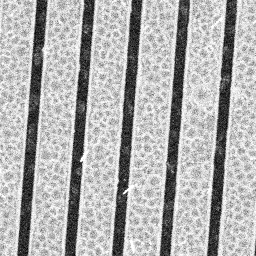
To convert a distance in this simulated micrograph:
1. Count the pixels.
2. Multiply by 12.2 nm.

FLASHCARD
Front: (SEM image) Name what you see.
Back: parallel lines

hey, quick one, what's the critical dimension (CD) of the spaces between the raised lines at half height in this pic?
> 164 nm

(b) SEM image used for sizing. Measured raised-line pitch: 579 nm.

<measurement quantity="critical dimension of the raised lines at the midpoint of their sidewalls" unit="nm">411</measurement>